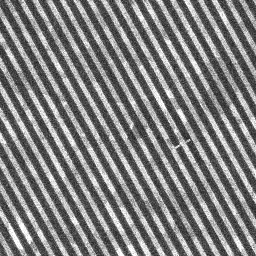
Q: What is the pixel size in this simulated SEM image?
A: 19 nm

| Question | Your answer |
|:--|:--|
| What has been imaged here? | parallel lines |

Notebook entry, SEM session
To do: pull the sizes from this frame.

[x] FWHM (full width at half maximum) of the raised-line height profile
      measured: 112 nm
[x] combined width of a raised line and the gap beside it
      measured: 230 nanometres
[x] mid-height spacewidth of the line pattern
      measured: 6.67 px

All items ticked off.